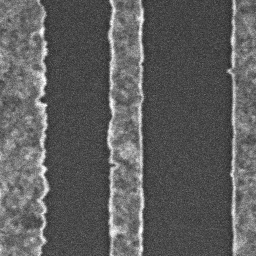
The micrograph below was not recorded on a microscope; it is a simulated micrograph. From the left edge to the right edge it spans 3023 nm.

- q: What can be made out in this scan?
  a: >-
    one or a few lines or trenches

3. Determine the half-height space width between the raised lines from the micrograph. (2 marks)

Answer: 981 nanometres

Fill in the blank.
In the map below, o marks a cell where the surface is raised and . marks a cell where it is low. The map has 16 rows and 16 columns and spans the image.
ooo....oo......o
ooo....oo......o
ooo....oo......o
ooo....oo......o
ooo....oo......o
ooo....oo......o
ooo....oo......o
ooo....oo......o
ooo....oo......o
ooo....oo......o
ooo....oo......o
ooo....oo......o
ooo....oo......o
ooo....oo......o
ooo....oo......o
ooo....oo......o